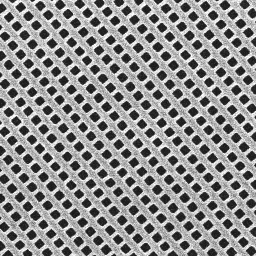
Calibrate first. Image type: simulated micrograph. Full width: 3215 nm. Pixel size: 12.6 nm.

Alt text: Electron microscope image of a regular array of holes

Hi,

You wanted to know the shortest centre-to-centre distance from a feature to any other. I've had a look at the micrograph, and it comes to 149 nm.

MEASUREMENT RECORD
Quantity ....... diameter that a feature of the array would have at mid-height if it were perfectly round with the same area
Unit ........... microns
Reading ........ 0.121